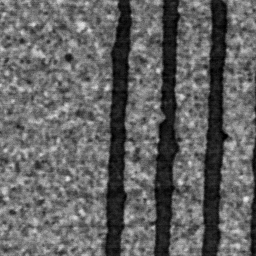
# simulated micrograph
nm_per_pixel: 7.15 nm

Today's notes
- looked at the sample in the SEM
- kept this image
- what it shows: parallel lines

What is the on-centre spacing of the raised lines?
343 nm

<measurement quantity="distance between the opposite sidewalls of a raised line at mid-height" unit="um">0.224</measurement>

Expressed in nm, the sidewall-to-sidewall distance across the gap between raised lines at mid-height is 121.